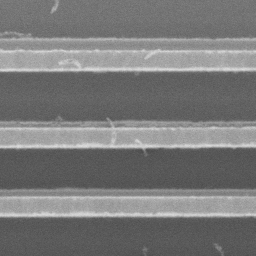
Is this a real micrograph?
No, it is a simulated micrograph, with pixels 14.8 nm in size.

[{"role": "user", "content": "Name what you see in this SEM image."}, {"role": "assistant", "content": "lines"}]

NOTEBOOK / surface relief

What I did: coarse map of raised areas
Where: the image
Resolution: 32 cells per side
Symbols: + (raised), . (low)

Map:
................................
................................
................................
................................
................................
++++++++++++++++++++++++++++++++
++++++++++++++++++++++++++++++++
++++++++++++++++++++++++++++++++
++++++++++++++++++++++++++++++++
................................
................................
................................
................................
................................
................................
++++++++++++++++++++++++++++++++
++++++++++++++++++++++++++++++++
++++++++++++++++++++++++++++++++
..+..............++.............
................................
................................
................................
................................
................................
++++++++++++++++++++++++++++++++
++++++++++++++++++++++++++++++++
++++++++++++++++++++++++++++++++
................................
................................
................................
................................
................................